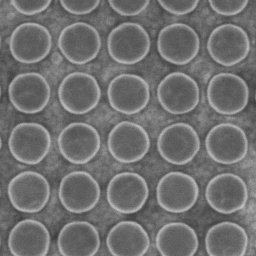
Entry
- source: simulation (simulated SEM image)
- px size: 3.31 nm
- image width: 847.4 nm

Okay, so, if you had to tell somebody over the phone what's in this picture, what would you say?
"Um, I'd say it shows a regular array of raised bodies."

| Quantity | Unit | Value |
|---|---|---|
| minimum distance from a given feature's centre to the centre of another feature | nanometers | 162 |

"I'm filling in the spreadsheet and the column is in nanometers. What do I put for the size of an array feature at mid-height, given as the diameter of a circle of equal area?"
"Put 133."